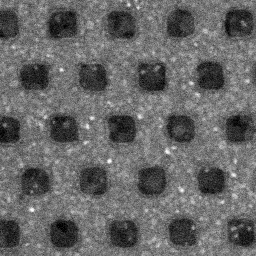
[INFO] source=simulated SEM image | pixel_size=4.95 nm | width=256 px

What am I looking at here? a regular array of raised bodies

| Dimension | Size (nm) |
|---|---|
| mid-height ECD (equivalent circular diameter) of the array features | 160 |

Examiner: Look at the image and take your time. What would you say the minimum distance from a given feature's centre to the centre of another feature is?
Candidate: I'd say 291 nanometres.